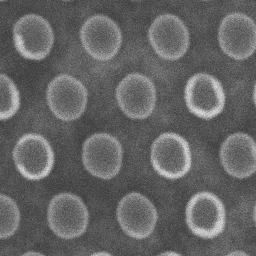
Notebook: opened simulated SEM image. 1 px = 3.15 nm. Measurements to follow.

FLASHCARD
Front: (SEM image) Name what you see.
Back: a regular array of raised bodies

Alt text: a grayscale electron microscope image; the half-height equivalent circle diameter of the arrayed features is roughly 0.134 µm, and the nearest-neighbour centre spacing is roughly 67.8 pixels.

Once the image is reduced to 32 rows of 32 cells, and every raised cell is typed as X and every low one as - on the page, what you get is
--------------------------------
--------------------------------
---XXX-----XXX-----XXX------XXX-
--XXXX----XXXXX----XXXX----XXXXX
--XXXXX---XXXXX----XXXX----XXXXX
--XXXXX---XXXXX----XXXXX----XXXX
--XXXX-----XXX------XXX-----XXXX
--------------------------------
--------------------------------
--------X-------XX------XX------
XX----XXXX-----XXXX----XXXXX----
XX----XXXXX----XXXX----XXXXX----
XX----XXXXX----XXXX----XXXXX----
XX----XXXXX----XXXX-----XXXX----
X------XXX------XX-------XX-----
--------------------------------
--------------------------------
---XXX-----XXX------XXX-----XXXX
--XXXX----XXXXX----XXXXX----XXXX
--XXXXX---XXXXX----XXXXX----XXXX
--XXXXX---XXXXX----XXXXX----XXXX
---XXX-----XXXX-----XXX------XXX
--------------------------------
--------------------------------
-------XX-------XX------XXX-----
XX----XXXX-----XXXX-----XXXX----
XX----XXXXX----XXXX----XXXXX----
XX----XXXXX----XXXXX---XXXXX----
XX----XXXXX----XXXX-----XXXX----
X------XXX------XX-------XX-----
--------------------------------
--------------------------------